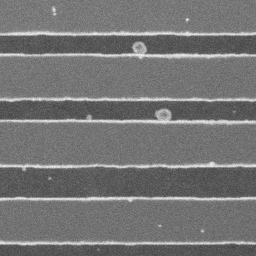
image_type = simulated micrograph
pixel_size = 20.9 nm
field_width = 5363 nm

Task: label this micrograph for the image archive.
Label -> lines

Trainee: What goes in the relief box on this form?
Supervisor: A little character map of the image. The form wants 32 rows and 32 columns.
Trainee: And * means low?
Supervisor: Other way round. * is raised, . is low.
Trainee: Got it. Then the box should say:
********************************
********************************
********************************
********************************
................................
................................
................................
********************************
********************************
********************************
********************************
********************************
***.*.**.***********************
................................
................................
********************************
********************************
********************************
********************************
********************************
********************************
................................
................................
................................
................................
********************************
********************************
********************************
********************************
********************************
..**.....*.....**...............
................................